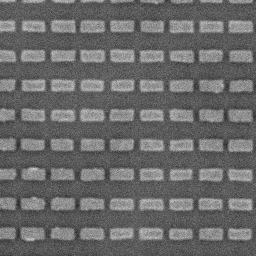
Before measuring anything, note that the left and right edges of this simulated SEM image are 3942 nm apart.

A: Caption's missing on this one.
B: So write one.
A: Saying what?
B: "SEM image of an array of small figures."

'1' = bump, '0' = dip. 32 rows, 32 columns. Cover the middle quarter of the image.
00000000000000000000000000000000
00000000000000000000000000000000
00000000000000000000000000000000
00000000000000000000000000000000
11000111100011111001100000001111
11000111100011111001111100011111
00000000000000110001110000011111
00000000000000000000000000000000
00000000000000000000000000000000
00000000000000000000000000000000
00000000000000000000000000000000
00000000000000000000000000000000
11000111110011111001111100011111
11000111110011111001111100011111
00000000000000000000000000000000
00000000000000000000000000000000
00000000000000000000000000000000
00000000000000000000000000000000
00000000000000000000000000000000
11000111110011111001111100011111
11001111110011111001111100011111
10000000000000000000000000000000
00000000000000000000000000000000
00000000000000000000000000000000
00000000000000000000000000000000
00000000000000000000000000000000
10000111110011111000000000000000
11001111110011111001111100011111
11001111110011111001111100011111
00000000000000000000000000000000
00000000000000000000000000000000
00000000000000000000000000000000